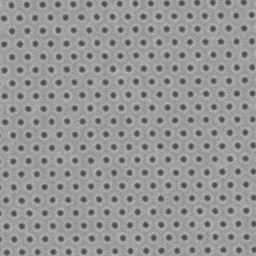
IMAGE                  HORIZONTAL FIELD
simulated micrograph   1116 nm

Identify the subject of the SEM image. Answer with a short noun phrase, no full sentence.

a regular array of holes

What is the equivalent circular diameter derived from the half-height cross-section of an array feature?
28.2 nm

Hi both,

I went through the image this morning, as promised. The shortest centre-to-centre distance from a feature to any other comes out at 14.8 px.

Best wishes